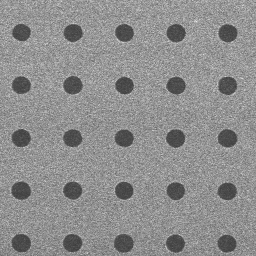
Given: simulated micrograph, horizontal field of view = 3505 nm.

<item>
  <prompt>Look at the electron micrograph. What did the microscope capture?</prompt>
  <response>a regular array of holes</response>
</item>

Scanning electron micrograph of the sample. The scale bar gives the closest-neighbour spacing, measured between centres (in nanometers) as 706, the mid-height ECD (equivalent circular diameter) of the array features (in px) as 18.8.